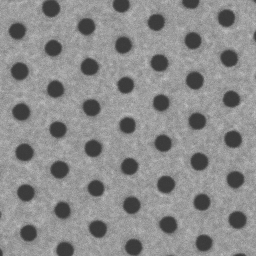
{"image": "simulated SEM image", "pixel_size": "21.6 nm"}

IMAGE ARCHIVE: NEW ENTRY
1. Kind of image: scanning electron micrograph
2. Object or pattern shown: a regular array of holes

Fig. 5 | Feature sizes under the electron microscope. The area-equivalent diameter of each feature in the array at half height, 381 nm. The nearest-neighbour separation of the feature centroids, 860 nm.